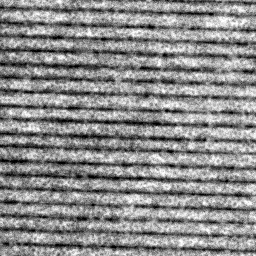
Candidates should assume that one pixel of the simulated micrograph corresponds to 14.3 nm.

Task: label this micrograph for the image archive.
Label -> parallel lines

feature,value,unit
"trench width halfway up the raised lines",0.15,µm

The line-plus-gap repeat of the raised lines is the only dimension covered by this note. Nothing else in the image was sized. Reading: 198 nm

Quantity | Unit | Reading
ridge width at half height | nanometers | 43